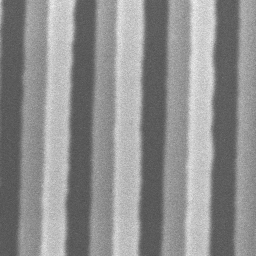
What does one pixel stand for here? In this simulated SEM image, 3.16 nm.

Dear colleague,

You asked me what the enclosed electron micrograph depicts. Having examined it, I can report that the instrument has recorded lines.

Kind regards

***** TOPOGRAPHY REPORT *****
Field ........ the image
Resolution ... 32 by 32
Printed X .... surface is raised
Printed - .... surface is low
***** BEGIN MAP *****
---XXXXXX---XXXXXX---XXXXXX---XX
---XXXXXX---XXXXXX---XXXXXX---XX
---XXXXXX---XXXXXX---XXXXXX---XX
---XXXXXX---XXXXXX---XXXXXX---XX
---XXXXXX---XXXXXX---XXXXXX---XX
---XXXXXX---XXXXXX---XXXXXX---XX
---XXXXXX---XXXXXX---XXXXX----XX
---XXXXXX---XXXXXX---XXXXX----XX
---XXXXXX---XXXXXX---XXXXXX---XX
---XXXXXX---XXXXXX---XXXXXX---XX
---XXXXXX---XXXXXX---XXXXXX---XX
---XXXXXX---XXXXXX---XXXXXX---XX
---XXXXXX---XXXXXX---XXXXX----XX
---XXXXXX---XXXXXX---XXXXX----XX
---XXXXXX---XXXXXX---XXXXX----XX
---XXXXXX---XXXXX----XXXXX----XX
---XXXXXX---XXXXX----XXXXX----XX
---XXXXXX---XXXXXX---XXXXX----XX
---XXXXXX---XXXXXX---XXXXX----XX
---XXXXXX---XXXXXX---XXXXX----XX
---XXXXX----XXXXXX---XXXXX----XX
---XXXXX----XXXXXX---XXXXX----XX
---XXXXX----XXXXXX---XXXXX----XX
---XXXXX----XXXXX---XXXXXX----XX
---XXXXX----XXXXX----XXXXX----XX
---XXXXX----XXXXX----XXXXX----XX
---XXXXX---XXXXXX----XXXXX----XX
---XXXXX---XXXXXX----XXXXX----XX
---XXXXX---XXXXXX---XXXXXX----XX
--XXXXXX---XXXXXX---XXXXXX---XXX
--XXXXXX---XXXXXX---XXXXXX---XXX
--XXXXXX---XXXXXX---XXXXXX---XXX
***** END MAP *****